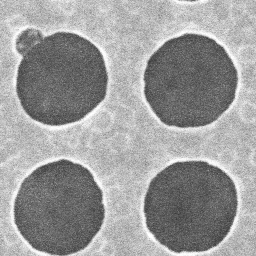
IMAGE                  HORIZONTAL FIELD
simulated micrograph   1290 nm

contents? holes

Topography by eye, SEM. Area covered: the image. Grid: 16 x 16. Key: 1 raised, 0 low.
1111111111111111
1111111111111111
1000011111100111
1000001110000011
1000000110000001
1000000110000001
1000001110000011
1100011111000011
1111111111111111
1111111111111111
1100011111000011
1000001110000001
1000001110000001
1000000110000001
1000001110000011
1100011111000111